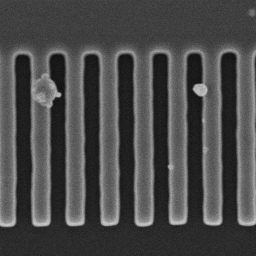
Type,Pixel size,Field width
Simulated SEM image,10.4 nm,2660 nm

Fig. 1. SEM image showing groups of lines, slits or small figures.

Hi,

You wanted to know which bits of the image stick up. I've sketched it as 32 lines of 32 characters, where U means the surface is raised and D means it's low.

UUUUUUUUUUUUUUUUUUUUUUUUUUUUUUUU
UUUUUUUUUUUUUUUUUUUUUUUUUUUUUUUU
UUUUUUUUUUUUUUUUUUUUUUUUUUUUUUUU
UUUUUUUUUUUUUUUUUUUUUUUUUUUUUUUU
UUUUUUUUUUUUUUUUUUUUUUUUUUUUUUUU
UUUUUUUUUUUUUUUUUUUUUUUUUUUUUUUU
UUUUUUUUUUUUUUUUUUUUUUUUUUUUDUUU
UUDDUUDDUUDDUUUDDUUDDUUDDUUUDDUU
UUDDUUDDUUDDDUUDDUUDDUUDDUUDDDUU
UUDDUUDDUUDDDUUDDUUDDUUDDUUDDDUU
UUDDUUUDUUDDDUUDDUUDDUUDDUUDDDUU
UUDDUUUDUUDDDUUDDUUDDUUDUUUUDDUU
UUDDUUUDUUDDDUUDDUUDDUUDDUUUDDUU
UUDDUUDDUUDDDUUDDUUDDUUDDUUUDDUU
UUDDUUDDUUDDDUUDDUUDDUUDDUUDDDUU
UUDDUUDDUUDDDUUDDUUDDUUDDUUUDDUU
UUDDUUDDUUDDDUUDDUUDDUUDDUUUDDUU
UUDDUUDDUUDDDUUDDUUDDUUDDUUUDDUU
UUDDUUDDUUDDDUUDDUUDDUUDDUUUDDUU
UUDDUUDDUUDDDUUDDUUDDUUDDUUUDDUU
UUDDUUDDUUDDDUUDDUUDDUUDDUUUDDUU
UUDDUUDDUUDDDUUDDUUDDUUDDUUUDDUU
UUDDUUDDUUDDDUUDDUUDDUUDDUUUDDUU
UUDDUUDDUUDDDUUDDUUDDUUDDDUUDDUU
UUDDUUDDUUDDDUUDDUUDDUUDDDUUDDUU
UUDDUUDDUUDDDUUDDUUDDUUDDDUUDDUU
UUDDUUDDUUDDDUUDDUUDDUUDDDUUDDUU
UUDDUUDDUUDDDUUDDUUDDUUDDDUUDDUU
DDDDDDDDDDDDDDDDDDDDDDDDDDDDDDDD
DDDDDDDDDDDDDDDDDDDDDDDDDDDDDDDD
DDDDDDDDDDDDDDDDDDDDDDDDDDDDDDDD
DDDDDDDDDDDDDDDDDDDDDDDDDDDDDDDD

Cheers